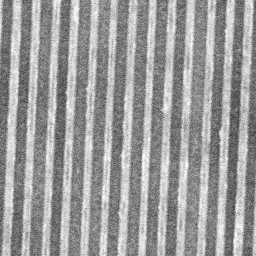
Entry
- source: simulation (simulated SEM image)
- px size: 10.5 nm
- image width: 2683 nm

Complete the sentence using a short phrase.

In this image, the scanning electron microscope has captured parallel lines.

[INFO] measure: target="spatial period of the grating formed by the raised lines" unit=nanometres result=202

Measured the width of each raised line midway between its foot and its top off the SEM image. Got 74.6 nanometers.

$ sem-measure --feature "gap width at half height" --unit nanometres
131